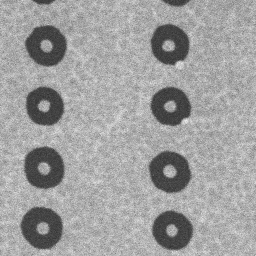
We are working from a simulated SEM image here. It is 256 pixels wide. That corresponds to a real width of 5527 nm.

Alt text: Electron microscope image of a regular array of ring-shaped grooves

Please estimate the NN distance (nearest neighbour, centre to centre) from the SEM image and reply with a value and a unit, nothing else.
1.3 micrometres